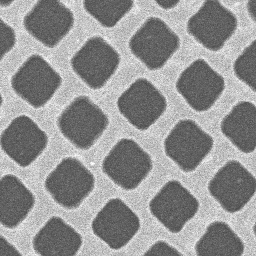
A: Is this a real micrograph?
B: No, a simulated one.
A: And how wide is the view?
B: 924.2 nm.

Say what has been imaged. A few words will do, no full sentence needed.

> a regular array of holes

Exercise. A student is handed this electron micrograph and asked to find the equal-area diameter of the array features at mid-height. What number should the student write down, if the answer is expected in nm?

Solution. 165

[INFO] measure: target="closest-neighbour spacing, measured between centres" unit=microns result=0.22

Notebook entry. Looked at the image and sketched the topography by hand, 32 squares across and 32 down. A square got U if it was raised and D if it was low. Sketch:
DUUUUDDDUUUDDDDDDUUUDDUUUDDDUUUD
UUUUDDDDDUUDDDDDUUUUUUUUUDDDDUUD
UUUDDDDDDUUUDDDUUUDDUUUUDDDDDDUU
DUUDDDDDDUUUUUUUUUDDDUUDDDDDDUUU
DDUUDDDDUUUUUUUUUDDDDDUUDDDDDUUU
DDUUUDDUUUUDDUUUDDDDDDUUUDDDUUUD
DUUUUUUUUUDDDDUUUDDDDDUUUUUUUUDD
UUUDDDUUUDDDDDDUUUDDDUUUUUUUUUDD
UUUDDDUUUDDDDDDUUUUDUUUDDDUUUDDD
UUDDDDDUUUDDDDUUUUUUUUUDDDDDUUDD
UUDDDDDUUUUDDUUUUDDUUUDDDDDDUUUD
UUDDDDDUUUUUUUUDDDDDUUDDDDDDUUUU
UUUDDDUUUDDUUUUDDDDDDUUDDDDUUUUU
UUUUUUUUDDDDUUUDDDDDDUUUDDUUUDDD
UUUUUUUUDDDDDUUDDDDDUUUUUUUUDDDD
UDDDUUUDDDDDDUUUUDDUUUDDUUUUDDDD
DDDDDUUUDDDDDUUUUUUUUDDDDUUUDDDD
DDDDDDUUUDDDUUUDUUUUUDDDDDDUUDDD
DDDDDDUUUUDUUUDDDDUUUDDDDDUUUUDD
UDDDDUUUUUUUUDDDDDDUUDDDDDUUUUUU
UUDDUUUDDDUUUDDDDDDUUUDDDUUUDDUU
UUUUUUDDDDDUUDDDDDDUUUUUUUUDDDDU
DDUUUUDDDDDDUUDDDDUUUUUUUUDDDDDD
DDDUUUDDDDDDUUUDDUUUDDDUUUDDDDDD
DDDDUUUDDDDUUUUUUUUDDDDDUUUDDDDD
DDDDUUUUDDUUUDDDUUUDDDDDDUUUDDDU
DDDDUUUUUUUUDDDDDUUDDDDDDUUUUUUU
DDDUUUDDUUUUDDDDDUUUDDDDUUUUUUUU
UUUUUDDDDUUUDDDDDUUUUDDUUUDDDUUU
UUUUDDDDDDUUDDDDDUUUUUUUUDDDDDUU
DUUUDDDDDDUUUDDDUUUDDUUUUDDDDDUU
DDUUUDDDDDUUUUUUUUDDDDUUUDDDDDUU